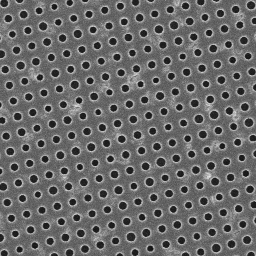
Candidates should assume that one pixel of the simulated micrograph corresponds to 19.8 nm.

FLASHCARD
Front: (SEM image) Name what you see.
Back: a regular array of holes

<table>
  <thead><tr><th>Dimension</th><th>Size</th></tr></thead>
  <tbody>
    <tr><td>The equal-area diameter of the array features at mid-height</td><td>147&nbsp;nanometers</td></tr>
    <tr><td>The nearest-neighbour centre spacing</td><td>0.313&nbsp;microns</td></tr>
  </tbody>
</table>